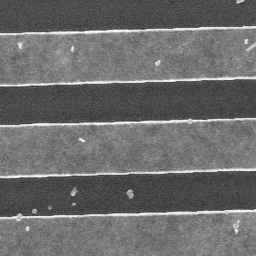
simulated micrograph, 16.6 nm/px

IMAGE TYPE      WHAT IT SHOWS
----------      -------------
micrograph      lines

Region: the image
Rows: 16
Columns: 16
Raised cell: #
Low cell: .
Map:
................
................
################
################
################
................
................
.............###
################
################
################
................
................
.#..############
################
################